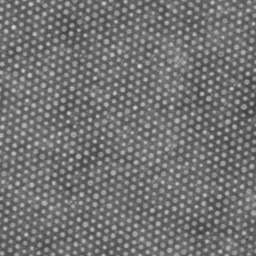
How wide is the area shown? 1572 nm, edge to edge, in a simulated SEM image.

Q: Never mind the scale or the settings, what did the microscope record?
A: a regular array of raised bodies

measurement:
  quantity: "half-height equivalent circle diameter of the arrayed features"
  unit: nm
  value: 24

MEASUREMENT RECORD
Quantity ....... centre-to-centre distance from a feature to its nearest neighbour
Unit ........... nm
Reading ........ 49.5